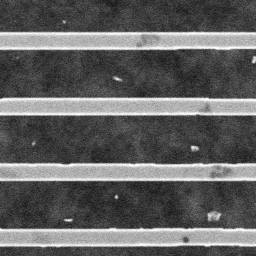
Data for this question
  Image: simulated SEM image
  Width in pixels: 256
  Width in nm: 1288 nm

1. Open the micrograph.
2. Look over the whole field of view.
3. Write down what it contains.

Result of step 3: lines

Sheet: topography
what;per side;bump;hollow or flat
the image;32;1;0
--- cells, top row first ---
00000000000000000000000000000000
00000000000000000000000000000000
00000000000000000000000000000000
00000000000000000000000000000000
11111111111111111111111111111111
11111111111111111111111111111111
00000000000000000000000000000000
00000000000000000000000000000000
00000000000000000000000000000000
00000000000000000000000000000000
00000000000000000000000000000000
00000000000000000000000000000000
11111111111111111111111111111111
11111111111111111111111111111111
00000000000000000000000000000000
00000000000000000000000000000000
00000000000000000000000000000000
00000000000000000000000000000000
00000000000000000000000000000000
00000000000000000000000000000000
00000000000000000000000000000000
11111111111111111111111111111111
11111111111111111111111111111111
00000000000000000000000000000000
00000000000000000000000000000000
00000000000000000000000000000000
00000000000000000000000000000000
00000000000000000000000000000000
00000000000000000000000000000000
11111111111111111111111111111111
11111111111111111111111111111111
00000000000000000000000000000000